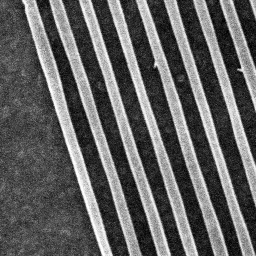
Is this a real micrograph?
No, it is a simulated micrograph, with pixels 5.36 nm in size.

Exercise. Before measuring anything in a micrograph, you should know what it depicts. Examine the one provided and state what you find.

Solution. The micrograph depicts parallel lines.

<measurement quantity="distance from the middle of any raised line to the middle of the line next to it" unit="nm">145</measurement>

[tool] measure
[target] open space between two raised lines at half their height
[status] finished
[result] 91.4 nanometres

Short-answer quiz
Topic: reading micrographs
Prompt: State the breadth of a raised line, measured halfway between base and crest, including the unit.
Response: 54.3 nm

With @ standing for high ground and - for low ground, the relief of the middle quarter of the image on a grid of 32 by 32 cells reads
--@@@----@@@----@@-----@@@----@@
--@@@-----@@----@@@-----@@-----@
---@@-----@@-----@@-----@@@----@
---@@@----@@-----@@-----@@@----@
---@@@----@@@----@@@-----@@-----
---@@@-----@@-----@@-----@@-----
----@@@----@@-----@@-----@@@----
----@@@----@@@----@@@----@@@----
----@@@-----@@-----@@-----@@@---
-----@@-----@@-----@@-----@@@---
@----@@@----@@@----@@-----@@@---
@----@@@----@@@-----@@-----@@---
@-----@@-----@@-----@@-----@@@--
@-----@@@----@@@----@@-----@@@--
@@----@@@----@@@-----@@-----@@--
@@-----@@-----@@-----@@-----@@@-
@@-----@@@----@@-----@@@----@@@-
@@@----@@@----@@@-----@@----@@@-
@@@-----@@----@@@-----@@-----@@@
@@@-----@@@----@@@----@@-----@@@
-@@@----@@@----@@@-----@@----@@@
-@@@-----@@----@@@-----@@-----@@
--@@-----@@@----@@@----@@@----@@
--@@@----@@@----@@@----@@@----@@
--@@@-----@@----@@@-----@@-----@
---@@-----@@@----@@-----@@@----@
---@@@----@@@----@@@----@@@----@
---@@@-----@@----@@@-----@@----@
---@@@-----@@-----@@-----@@@----
----@@-----@@@----@@@----@@@----
----@@@-----@@----@@@----@@@----
----@@@-----@@-----@@-----@@@---